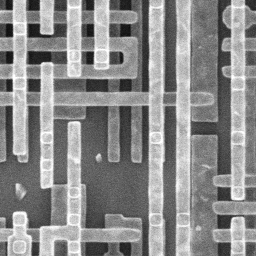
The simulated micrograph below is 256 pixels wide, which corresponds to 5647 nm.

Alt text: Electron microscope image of wiring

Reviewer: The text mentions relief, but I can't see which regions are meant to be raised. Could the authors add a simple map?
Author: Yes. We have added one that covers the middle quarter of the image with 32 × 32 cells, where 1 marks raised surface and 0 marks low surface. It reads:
11111111111111111100011110001110
11111111111111111100011110001110
11111111111111111100011110001110
11111111111111111100011110001110
00000000000000000000011110001110
00000000000000000000011110001110
00000000000000000000011110001110
11111111111111111111111111111111
11111111111111111111111111111111
11111111111111111111111111111111
00000000000000000000011110001111
00000000000000000000011110001110
00000000000000000000011110001110
00000000000000000000011110001110
00000000000000000000011110001110
01110000000000000000011110001110
01110000000000000000011110001110
01110000000000000000011110001110
01110000000000000000011110001110
01110000000000000000011110001110
01110000000000000000011110001110
01110000000000000000011110001110
01110000000000000000011110001110
01110000000000000000011110001110
01110000000000000000011110001110
01110000000000000000011110001110
01110000000000000000011110001110
01110000000000000000011110001110
01110000000000000000011110001110
01110000000000000000011110001110
01110000000000000000011110001110
01110000000000000000011110001110